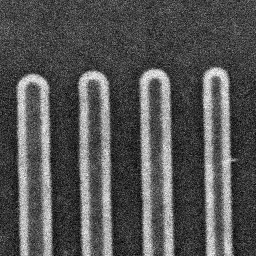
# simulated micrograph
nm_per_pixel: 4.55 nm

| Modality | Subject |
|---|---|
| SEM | one or a few lines or trenches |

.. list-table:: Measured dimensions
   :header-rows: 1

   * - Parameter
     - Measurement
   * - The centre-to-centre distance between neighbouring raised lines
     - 278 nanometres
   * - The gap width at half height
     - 182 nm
